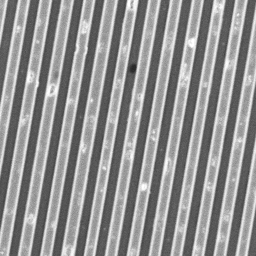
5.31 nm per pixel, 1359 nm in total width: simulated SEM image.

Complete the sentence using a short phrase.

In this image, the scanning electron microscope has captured parallel lines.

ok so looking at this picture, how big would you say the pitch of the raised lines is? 114 nanometres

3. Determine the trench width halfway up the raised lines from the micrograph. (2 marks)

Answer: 0.0582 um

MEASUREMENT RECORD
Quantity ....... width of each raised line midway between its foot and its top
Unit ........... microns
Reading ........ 0.0582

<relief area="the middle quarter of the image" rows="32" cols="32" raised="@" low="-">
--@@@---@@@--@@@---@@---@@@--@@@
--@@@--@@@---@@---@@@---@@---@@@
--@@---@@@---@@---@@@---@@---@@@
--@@---@@@---@@---@@@--@@@---@@-
--@@---@@@---@@---@@@--@@@---@@-
-@@@---@@@--@@@---@@---@@@---@@-
-@@@--@@@---@@@---@@---@@@--@@@-
-@@@--@@@---@@---@@@---@@---@@@-
-@@@--@@@---@@---@@@---@@---@@@-
-@@---@@@---@@---@@@--@@@---@@--
-@@---@@@--@@@---@@@--@@@---@@--
@@@---@@@--@@@---@@---@@@---@@--
@@@--@@@---@@@---@@---@@@--@@@--
@@---@@@---@@---@@@---@@---@@@--
@@---@@@---@@---@@@---@@---@@@--
@@---@@@---@@---@@@--@@@---@@---
@@---@@@--@@@---@@@--@@@---@@---
@@--@@@@--@@@---@@---@@@---@@---
@@--@@@---@@@--@@@---@@@--@@@---
@---@@@---@@---@@@---@@---@@@---
@---@@@---@@---@@@---@@---@@@--@
@---@@@---@@---@@@--@@@---@@---@
@---@@@--@@@---@@---@@@---@@---@
@--@@@@--@@@---@@---@@@---@@---@
@--@@@---@@@--@@@---@@---@@@---@
---@@@---@@---@@@---@@---@@@---@
---@@@---@@---@@@--@@@---@@@--@@
---@@@---@@---@@@--@@@---@@---@@
---@@@--@@@---@@---@@@---@@---@@
--@@@@--@@@---@@---@@@---@@---@@
--@@@---@@@--@@@---@@---@@@---@@
--@@@---@@---@@@---@@---@@@---@@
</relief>